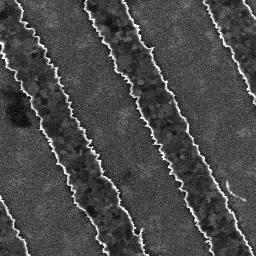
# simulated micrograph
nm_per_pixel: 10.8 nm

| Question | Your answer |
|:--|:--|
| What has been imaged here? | one or a few lines or trenches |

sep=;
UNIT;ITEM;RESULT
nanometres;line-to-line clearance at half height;663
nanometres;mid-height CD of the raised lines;383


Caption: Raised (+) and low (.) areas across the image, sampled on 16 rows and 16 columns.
+....+++.....+++
++....++.....+++
++....+++.....++
+++....+++.....+
.+++...+++.....+
.+++....+++.....
..++.....++.....
..+++....+++....
...++.....++....
...+++....++....
....++.....++...
....+++....+++..
.....++.....++..
+....+++....+++.
+.....+++....++.
++....+++....+++